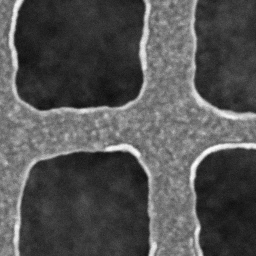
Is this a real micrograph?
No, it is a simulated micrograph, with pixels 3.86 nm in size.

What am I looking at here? holes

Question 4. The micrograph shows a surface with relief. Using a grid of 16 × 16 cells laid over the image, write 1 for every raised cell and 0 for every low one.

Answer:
1000000001110000
1000000001110000
1000000001110000
1000000001110000
1000000001110000
1000000001110000
1100000011111000
1111111111111111
1111111111111111
1111100011111000
1100000001110000
1100000001110000
1000000001110000
1000000001110000
1000000001110000
1000000001111000